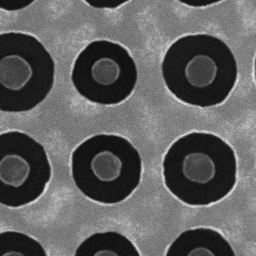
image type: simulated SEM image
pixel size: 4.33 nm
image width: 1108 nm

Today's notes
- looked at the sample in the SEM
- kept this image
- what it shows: ring-shaped grooves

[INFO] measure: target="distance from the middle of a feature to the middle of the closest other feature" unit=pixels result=94.6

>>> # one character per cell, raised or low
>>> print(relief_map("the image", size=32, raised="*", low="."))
....*******....********...******
********************************
********************************
********************************
....*******************...******
.....******....*******......****
......****......*****........***
***....***..**...***....***..***
****...**...***..***...****...**
****...**...***..***...****...**
***....**....*...****...**...***
......****......*****........***
.....******....********.....****
....****************************
********************************
********************************
*..*****************************
....*******.....******......****
.....*****.......****........***
.*....***...**...****..***...***
****..***..****...**...****...**
****..***...***...***..****..***
***...***....*...****...**...***
......****.......****........***
.....******.....******......****
...*********************..******
********************************
********************************
********************************
....*******....*******......****
.....*****.......****........***
.*....***...**...****...**...***